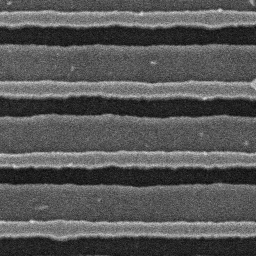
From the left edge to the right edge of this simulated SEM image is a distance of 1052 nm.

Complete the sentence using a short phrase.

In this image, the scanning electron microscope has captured lines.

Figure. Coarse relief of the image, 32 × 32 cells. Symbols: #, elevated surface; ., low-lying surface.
################################
################################
################################
..........................#.....
................................
................................
################################
################################
################################
################################
################################
################################
................................
................................
....############..........###...
################################
################################
################################
################################
################################
################################
................................
................................
################################
################################
################################
################################
################################
################################
###...####....#.....############
................................
................................